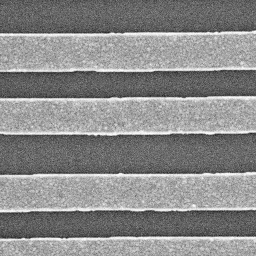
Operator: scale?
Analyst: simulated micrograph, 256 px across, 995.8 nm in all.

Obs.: lines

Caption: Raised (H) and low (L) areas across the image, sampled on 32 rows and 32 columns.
LLLLLLLLLLLLLLLLLLLLLLLLLLLLLLLL
LLLLLLLLLLLLLLLLLLLLLLLLLLLLLLLL
LLLLLLLLLLLLLLLLLLLLLLLLLLLLLLLL
LLLLLLLLLLLLLLLLLLLLLLLLLLLLLLLL
HHHHHHHHHHHHHHHHHHHHHHHHHHHHHHHH
HHHHHHHHHHHHHHHHHHHHHHHHHHHHHHHH
HHHHHHHHHHHHHHHHHHHHHHHHHHHHHHHH
HHHHHHHHHHHHHHHHHHHHHHHHHHHHHHHH
HHHHHHHHHHHHHHHHHHHHHHHHHHHHHHHH
LLLLLLLLLLLLLLLLLLLLLLLLLLLLLLLL
LLLLLLLLLLLLLLLLLLLLLLLLLLLLLLLL
LLLLLLLLLLLLLLLLLLLLLLLLLLLLLLLL
HHHHHHHHHHHHHHHHHHHHHHHHHHHHHHHH
HHHHHHHHHHHHHHHHHHHHHHHHHHHHHHHH
HHHHHHHHHHHHHHHHHHHHHHHHHHHHHHHH
HHHHHHHHHHHHHHHHHHHHHHHHHHHHHHHH
HHHHHHHHHHHHHHHHHHHHHHHHHHHHHHHL
LLLLLLLLLLLLLLLLLLLLLLLLLLLLLLLL
LLLLLLLLLLLLLLLLLLLLLLLLLLLLLLLL
LLLLLLLLLLLLLLLLLLLLLLLLLLLLLLLL
LLLLLLLLLLLLLLLLLLLLLLLLLLLLLLLL
LLLLLLLLLLLLLLLLLLLLLLLLLLLLLLLL
HHHHHHHHHHHHHHHHHHHHHHHHHHHHHHHH
HHHHHHHHHHHHHHHHHHHHHHHHHHHHHHHH
HHHHHHHHHHHHHHHHHHHHHHHHHHHHHHHH
HHHHHHHHHHHHHHHHHHHHHHHHHHHHHHHH
LLLLLLLLLLLLLLLLLLLLLLLLLLLLLLLL
LLLLLLLLLLLLLLLLLLLLLLLLLLLLLLLL
LLLLLLLLLLLLLLLLLLLLLLLLLLLLLLLL
LLLLLLLLLLLLLLLLLLLLLLLLLLLLLLLL
HHHHHHHHHHHHHHHHHHHHHHHHHHHHHHHH
HHHHHHHHHHHHHHHHHHHHHHHHHHHHHHHH